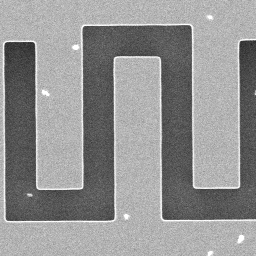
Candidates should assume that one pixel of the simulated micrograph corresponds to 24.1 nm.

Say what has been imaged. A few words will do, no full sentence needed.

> groups of lines, slits or small figures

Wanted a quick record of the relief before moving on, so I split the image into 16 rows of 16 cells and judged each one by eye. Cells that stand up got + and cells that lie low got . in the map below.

++++++++++++++++
++++++++++++++++
+++++.......++++
..+++.......+++.
..+++..+++..+++.
..+++..+++..+++.
..+++..+++..+++.
..+++..+++..+++.
..+++..+++..+++.
..+++..+++..+++.
..+++..+++..+++.
..+++..+++..+++.
.......+++......
.......+++......
++++++++++++++++
++++++++++++++++